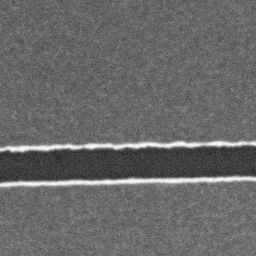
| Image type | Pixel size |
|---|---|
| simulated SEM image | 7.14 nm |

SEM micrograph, one or a few lines or trenches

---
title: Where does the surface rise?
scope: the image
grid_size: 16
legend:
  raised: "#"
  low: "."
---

################
################
################
################
################
################
################
################
################
................
................
.###############
################
################
################
################